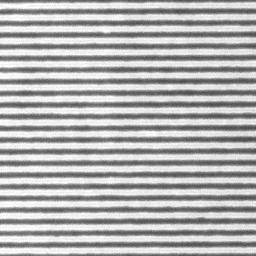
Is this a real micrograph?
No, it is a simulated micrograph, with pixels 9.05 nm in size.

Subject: parallel lines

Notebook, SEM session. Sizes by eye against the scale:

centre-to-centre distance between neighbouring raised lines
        0.105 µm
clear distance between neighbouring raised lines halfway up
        27.1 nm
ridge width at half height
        76.9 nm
